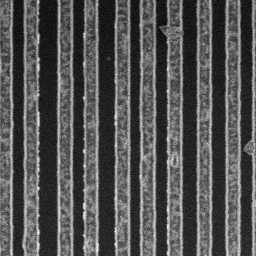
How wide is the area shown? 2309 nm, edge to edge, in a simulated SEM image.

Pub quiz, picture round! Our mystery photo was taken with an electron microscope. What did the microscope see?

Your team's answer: parallel lines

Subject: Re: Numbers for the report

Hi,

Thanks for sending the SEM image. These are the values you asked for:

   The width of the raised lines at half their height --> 121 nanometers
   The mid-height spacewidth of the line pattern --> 128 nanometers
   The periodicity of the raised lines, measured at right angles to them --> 260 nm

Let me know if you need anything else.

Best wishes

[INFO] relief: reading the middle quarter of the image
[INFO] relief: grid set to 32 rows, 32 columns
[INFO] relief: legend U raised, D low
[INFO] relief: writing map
UUDDDUUUDDDDDUUUDDDUUUUDDDUUUDDD
UUDDDUUUDDDDDUUUDDDUUUUDDDUUUDDD
UUDDDUUUDDDDDUUUDDDUUUUDDDUUUDDD
UUDDDUUUDDDDDUUUDDDUUUUDDDUUUDDD
UUDDDUUUDDDDDUUUDDDUUUUDDDUUUDDD
UUDDDUUUDDDDDUUUDDDUUUUDDDUUUDDD
UUDDDUUUDDDDDUUUDDDUUUUDDDUUUDDD
UUDDDUUUDDDDDUUUDDDUUUUDDDUUUDDD
UUDDDUUUDDDDDUUUDDDUUUUDDDUUUDDD
UUDDDUUUDDDDDUUUDDDUUUUDDDUUUDDD
UUDDDUUUDDDDDUUUDDDUUUUDDDUUUDDD
UUDDDUUUDDDDDUUUDDDUUUUDDDUUUDDD
UUDDDUUUDDDDDUUUDDDUUUUDDDUUUDDD
UUDDDUUUDDDDDUUUDDDUUUUDDDUUUDDD
UUDDDUUUDDDDDUUUDDDUUUUDDDUUUDDD
UUDDDUUUDDDDDUUUDDDUUUUDDDUUUDDD
UUDDDUUUDDDDDUUUDDDUUUUDDDUUUDDD
UUDDDUUUDDDDDUUUDDDUUUUDDDUUUDDD
UUDDDUUUDDDDDUUUDDDUUUUDDDUUUDDD
UUDDDUUUDDDDDUUUDDDUUUUDDDUUUDDD
UUDDDUUUDDDDDUUUDDDUUUUDDDUUUDDD
UUDDDUUUDDDDDUUUDDDUUUUDDDUUUDDD
UUDDDUUUDDDDDUUUDDDUUUUDDDUUUDDD
UUDDDUUUDDDDDUUUDDDUUUUDDDUUUDDD
UUDDDUUUDDDDDUUUDDDUUUUDDDUUUDDD
UUDDDUUUDDDDDUUUDDDUUUUDDDUUUDDD
UUDDDUUUDDDDDUUUDDDUUUUDDDUUUDDD
UUDDDUUUDDDDDUUUDDDUUUUDDDUUUDDD
UUDDDUUUDDDDDUUUDDDUUUUDDDUUUDDD
UUDDDUUUDDDDDUUUDDDUUUUDDDUUUDDD
UUDDDUUUDDDDDUUUDDDUUUUDDDUUUDDD
UUDDDUUUDDDDDUUUDDDUUUUDDDUUUDDD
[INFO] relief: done